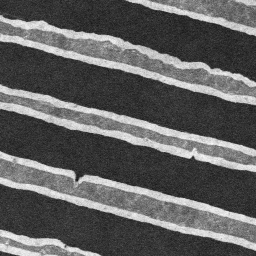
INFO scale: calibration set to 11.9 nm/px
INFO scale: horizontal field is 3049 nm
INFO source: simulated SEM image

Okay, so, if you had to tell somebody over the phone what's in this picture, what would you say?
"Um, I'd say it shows one or a few lines or trenches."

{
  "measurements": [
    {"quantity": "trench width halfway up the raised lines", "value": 584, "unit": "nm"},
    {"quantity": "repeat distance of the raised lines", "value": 822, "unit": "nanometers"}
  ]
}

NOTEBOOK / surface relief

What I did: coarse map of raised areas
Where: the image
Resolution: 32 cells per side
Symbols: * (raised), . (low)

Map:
...................*************
.......................*********
...........................*****
******........................**
***********.....................
....***********.................
.......***********..............
...........**********...........
................**********......
...................**********...
.......................*********
*..........................*****
******.........................*
..********......................
.....*********..................
.........*********..............
.............********...........
.................********.......
.....................*********..
.........................*******
****........................****
*******.........................
*********.**....................
....************................
........************............
...........*************........
...............************.....
...................************.
......................**********
*..........................*****
*******........................*
..********......................